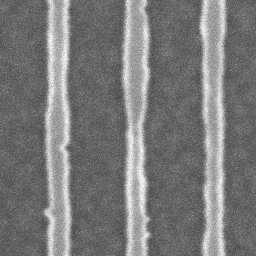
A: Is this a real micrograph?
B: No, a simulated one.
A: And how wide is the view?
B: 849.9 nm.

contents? one or a few lines or trenches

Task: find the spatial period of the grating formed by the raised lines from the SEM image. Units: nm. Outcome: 258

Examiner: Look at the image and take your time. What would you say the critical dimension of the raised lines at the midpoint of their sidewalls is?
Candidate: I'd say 51.4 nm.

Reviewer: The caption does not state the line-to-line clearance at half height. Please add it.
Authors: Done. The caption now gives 205 nm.